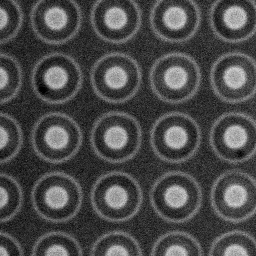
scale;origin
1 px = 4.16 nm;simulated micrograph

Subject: an array of small figures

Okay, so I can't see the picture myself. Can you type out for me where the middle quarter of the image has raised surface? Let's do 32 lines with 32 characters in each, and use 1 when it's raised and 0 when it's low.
00011111000000000011111000000000
00011111000111100011110000111100
00001110000111100001110001111100
00001110001111100001110001111110
00001111000111100001110001111100
00011111000111000011111000111100
00011111000000000011111000000000
00111111100000000111111100000000
01111111111000001111111110000011
11111111111111111111111111111111
11111111111111111111111111111111
11111111111111111111111111111111
11111111111111111111111111111111
01111111110000001111111110000001
00111111100000000011111100000000
00011111000000000011111000000000
00011111000111100001111000111100
10001110001111100001110001111100
10001110001111100001110001111110
10001110001111100001110000111100
00011111000111100011111000111000
00011111000000000011111000000000
00111111100000000111111100000001
11111111111000001111111110000011
11111111111111111111111111111111
11111111111111111111111111111111
11111111111111111111111111111111
11111111111111111111111111111111
01111111110000001111111110000001
00111111100000000111111100000000
00011111000000000011111000000000
00001111000111100001110000111100